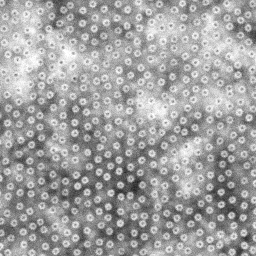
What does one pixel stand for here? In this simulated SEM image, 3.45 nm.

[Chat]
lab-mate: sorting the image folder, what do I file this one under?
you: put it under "a regular array of raised bodies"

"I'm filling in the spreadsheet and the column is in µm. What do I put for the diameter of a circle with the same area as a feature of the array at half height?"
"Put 0.0194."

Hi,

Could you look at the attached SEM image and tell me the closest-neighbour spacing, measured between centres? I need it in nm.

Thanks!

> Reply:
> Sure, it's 36.7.